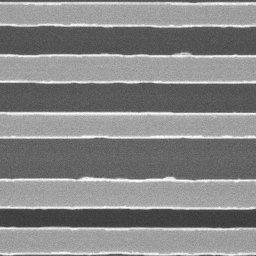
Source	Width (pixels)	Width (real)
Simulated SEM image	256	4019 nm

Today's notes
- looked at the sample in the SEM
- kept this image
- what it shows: lines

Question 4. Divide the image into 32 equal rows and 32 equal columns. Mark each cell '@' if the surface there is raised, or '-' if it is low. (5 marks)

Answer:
@@@@@@@@@@@@@@@@@@@@@@@@@@@@@@@@
@@@@@@@@@@@@@@@@@@@@@@@@@@@@@@@@
@@@@@@@@@@@@@@@@@@@@@@@@@@@@@@@@
--------------------------------
--------------------------------
--------------------------------
--------------------------------
@@@@@@@@@@@@@@@@@@@@@@@@@@@@@@@@
@@@@@@@@@@@@@@@@@@@@@@@@@@@@@@@@
@@@@@@@@@@@@@@@@@@@@@@@@@@@@@@@@
--------------------------------
--------------------------------
--------------------------------
--------------------------------
@@@@@@@@@@@@@@@@@@@@@@@@@@@@@@@@
@@@@@@@@@@@@@@@@@@@@@@@@@@@@@@@@
@@@@@@@@@@@@@@@@@@@@@@@@@@@@@@@@
--------------------------------
--------------------------------
--------------------------------
--------------------------------
--------------------------------
@@@@@@@@@@@@@@-@--@@@@----------
@@@@@@@@@@@@@@@@@@@@@@@@@@@@@@@@
@@@@@@@@@@@@@@@@@@@@@@@@@@@@@@@@
@@@@@@@@@@@@@@@@@@@@@@@@@@@@@@@@
--------------------------------
--------------------------------
--------------------------------
@@@@@@@@@@@@@@@@@@@@@@@@@@@@@@@@
@@@@@@@@@@@@@@@@@@@@@@@@@@@@@@@@
@@@@@@@@@@@@@@@@@@@@@@@@@@@@@@@@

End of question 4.